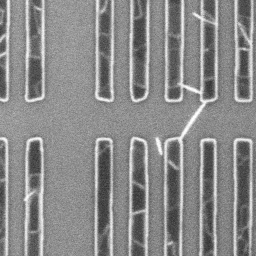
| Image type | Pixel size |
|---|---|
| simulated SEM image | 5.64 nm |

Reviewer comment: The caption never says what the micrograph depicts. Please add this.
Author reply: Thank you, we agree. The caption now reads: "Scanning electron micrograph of wiring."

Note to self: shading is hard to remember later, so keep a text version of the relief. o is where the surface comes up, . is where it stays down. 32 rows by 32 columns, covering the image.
o..oo.......oo..ooo..oo..oo..ooo
o..oo.......oo..ooo..oo..oo..ooo
o..oo.......oo..ooo..oo..oo..ooo
o..oo.......oo..oo...oo..oo..ooo
o..oo.......oo..ooo..oo..oo..ooo
o..oo.......oo..ooo..oo..oo..ooo
o..oo.......oo..ooo..oo..oo...o.
o..oo.......oo..ooo..oo..oo...o.
o..oo.......oo..oo...oo..oo..oo.
o..oo.......oo..oo...oo..oo..oo.
o..oo.......oo..oo...oo..oo..oo.
o..oo.......oo..oo...oo..oo..oo.
o..o.........o...o...o...oo...o.
................................
................................
................................
................................
o...o.......oo...o...oo...o...o.
o..oo.......oo..oo...oo..oo..oo.
o..oo.......oo..oo...oo..oo..oo.
o..oo.......oo..oo...oo..oo..oo.
o..oo.......oo..oo...oo..oo..oo.
o..oo.......oo..oo...oo..oo..oo.
o..oo.......oo..oo...oo..oo..oo.
o..oo.......oo..oo...oo..oo..oo.
o..oo.......oo..oo...oo..oo..oo.
o..oo.......oo..oo...oo..oo..oo.
o..oo.......oo..oo...oo..oo..oo.
o..oo.......oo..oo...oo..oo..oo.
o..oo.......oo..oo...oo..oo..oo.
o..oo.......oo..oo...oo..oo..oo.
o..oo.......oo..oo...oo..oo..oo.